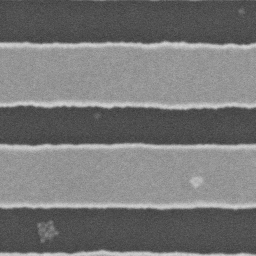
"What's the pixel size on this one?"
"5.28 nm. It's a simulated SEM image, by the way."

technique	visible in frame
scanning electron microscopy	lines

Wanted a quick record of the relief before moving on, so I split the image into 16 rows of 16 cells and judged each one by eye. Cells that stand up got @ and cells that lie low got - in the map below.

----------------
----------------
----------------
@@@@@@@@@@@@@@@@
@@@@@@@@@@@@@@@@
@@@@@@@@@@@@@@@@
@@@@@@@@@@@@@@@@
----------------
----------------
@@@@@@@@@@@@@@@@
@@@@@@@@@@@@@@@@
@@@@@@@@@@@@@@@@
@@@@@@@@@@@@@@@@
----------------
----------------
----------------